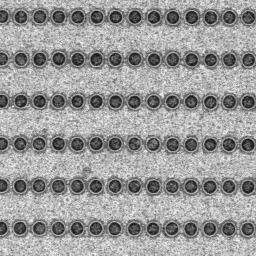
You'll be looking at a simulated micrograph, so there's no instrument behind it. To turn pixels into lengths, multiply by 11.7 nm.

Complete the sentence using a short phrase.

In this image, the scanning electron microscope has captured a regular array of raised bodies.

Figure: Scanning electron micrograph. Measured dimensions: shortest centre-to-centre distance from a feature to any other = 18.7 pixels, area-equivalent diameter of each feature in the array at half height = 165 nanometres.